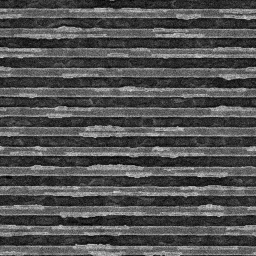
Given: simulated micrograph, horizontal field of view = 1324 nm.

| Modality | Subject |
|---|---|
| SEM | parallel lines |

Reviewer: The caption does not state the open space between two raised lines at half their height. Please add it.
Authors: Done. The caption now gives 56.2 nm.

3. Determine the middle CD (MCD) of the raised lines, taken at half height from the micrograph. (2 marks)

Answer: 0.0427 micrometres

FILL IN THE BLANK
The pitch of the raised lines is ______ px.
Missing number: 19.8